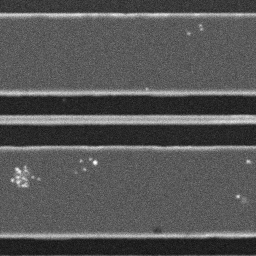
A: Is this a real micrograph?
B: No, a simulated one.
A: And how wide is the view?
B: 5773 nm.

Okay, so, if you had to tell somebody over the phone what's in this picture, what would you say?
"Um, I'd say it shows lines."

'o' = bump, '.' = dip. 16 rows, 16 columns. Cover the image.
................
oooooooooooooooo
oooooooooooooooo
oooooooooooooooo
oooooooooooooooo
oooooooooooooooo
................
................
................
oooooooooooooooo
oooooooooooooooo
oooooooooooooooo
oooooooooooooooo
oooooooooooooooo
oooooooooooooooo
................